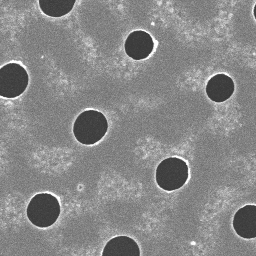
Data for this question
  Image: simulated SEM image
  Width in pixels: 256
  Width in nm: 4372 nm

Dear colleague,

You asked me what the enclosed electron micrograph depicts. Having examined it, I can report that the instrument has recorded holes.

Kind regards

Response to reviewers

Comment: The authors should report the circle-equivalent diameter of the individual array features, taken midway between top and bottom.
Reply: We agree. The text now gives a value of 33.4 px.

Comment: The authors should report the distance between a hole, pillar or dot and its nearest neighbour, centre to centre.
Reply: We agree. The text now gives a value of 1610 nanometres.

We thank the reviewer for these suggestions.